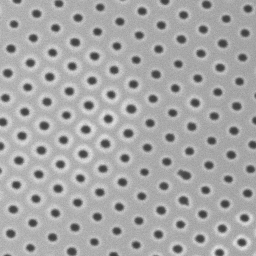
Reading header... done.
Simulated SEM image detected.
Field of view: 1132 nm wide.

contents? a regular array of holes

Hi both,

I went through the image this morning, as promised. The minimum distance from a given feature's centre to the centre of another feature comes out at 0.106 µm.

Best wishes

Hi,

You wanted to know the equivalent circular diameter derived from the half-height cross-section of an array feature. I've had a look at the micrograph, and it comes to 41.7 nanometers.